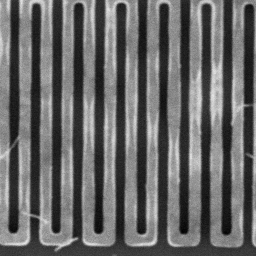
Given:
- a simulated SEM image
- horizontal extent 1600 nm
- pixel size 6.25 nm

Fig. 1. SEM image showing groups of lines, slits or small figures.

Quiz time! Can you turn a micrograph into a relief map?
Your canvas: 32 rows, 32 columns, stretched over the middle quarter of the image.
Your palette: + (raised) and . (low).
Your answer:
++...++...+++...++...++....++...
++...++...+++...++...++...+++...
++...++...+++...++...++...+++...
++...++...+++...++...++...+++...
++...++...+++...++...+++..+++...
++...++...+++...++...+++..+++...
++...++...+++...++...+++..+++...
++...++...+++...++...+++..+++...
++...++...+++...++...+++..+++...
++...++...+++...++...+++..+++...
++...++...+++...++...+++..+++...
++...++...+++...++...+++..+++...
++...++...+++...++...+++..+++...
++...++...+++...++...++...+++...
++...++...+++...++...++...+++...
++...++...+++...++...++...+++...
++...++...+++...++...++...+++...
++...++...++....++...++...+++...
++...++...++....++...++....+....
++...++...++....++...++....+....
++...++...++....++...++....+....
++...++...++....++...++....+....
++...++...++....++...++....+....
++...++...++....++...++....+....
++...++...++....++...++...++....
++...++...++....++...++...++....
++...++...++....++...++...++...+
++...++...++....++...++...++...+
++...++...++....++...++...++...+
++...++...++...+++...++...++...+
++...++...+++..+++...++...+++..+
++...++...+++..+++...++...+++..+